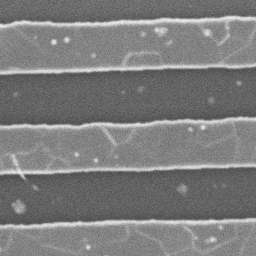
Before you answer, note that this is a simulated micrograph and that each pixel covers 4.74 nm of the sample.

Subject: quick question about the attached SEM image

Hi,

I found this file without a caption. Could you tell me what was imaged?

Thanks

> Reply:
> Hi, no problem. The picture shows lines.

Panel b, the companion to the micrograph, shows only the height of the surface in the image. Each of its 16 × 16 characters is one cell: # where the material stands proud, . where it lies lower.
................
################
################
################
####............
................
................
..............##
################
################
#############...
................
................
................
################
################